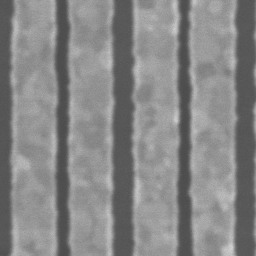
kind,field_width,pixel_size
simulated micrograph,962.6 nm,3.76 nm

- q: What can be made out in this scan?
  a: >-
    lines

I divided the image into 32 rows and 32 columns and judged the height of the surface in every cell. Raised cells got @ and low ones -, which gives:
--@@@@@--@@@@@---@@@@@--@@@@@---
--@@@@@--@@@@@---@@@@@--@@@@@---
--@@@@@--@@@@@---@@@@@--@@@@@---
--@@@@@--@@@@@---@@@@@--@@@@@---
--@@@@@--@@@@@---@@@@@--@@@@@---
-@@@@@@--@@@@@---@@@@@--@@@@@---
-@@@@@@--@@@@@---@@@@@--@@@@@---
-@@@@@@--@@@@@---@@@@@--@@@@@---
--@@@@@--@@@@@---@@@@@--@@@@@---
-@@@@@@--@@@@@---@@@@@--@@@@@---
-@@@@@@--@@@@@---@@@@@--@@@@@---
--@@@@@--@@@@@---@@@@@--@@@@@---
--@@@@@--@@@@@---@@@@@--@@@@@---
--@@@@@--@@@@@---@@@@@--@@@@@---
--@@@@@--@@@@@---@@@@@--@@@@@---
--@@@@@--@@@@@---@@@@@--@@@@@---
--@@@@@--@@@@@---@@@@@--@@@@@---
--@@@@@--@@@@@---@@@@@--@@@@@---
--@@@@@--@@@@@---@@@@@--@@@@@---
-@@@@@@--@@@@@---@@@@@--@@@@@---
-@@@@@@--@@@@@---@@@@@--@@@@@---
--@@@@@--@@@@@---@@@@@--@@@@@---
--@@@@@--@@@@@---@@@@@--@@@@@---
--@@@@@--@@@@@---@@@@@--@@@@@---
-@@@@@@--@@@@@---@@@@@--@@@@@---
-@@@@@@--@@@@@---@@@@@--@@@@@---
-@@@@@@--@@@@@---@@@@@--@@@@@---
--@@@@@--@@@@@---@@@@@--@@@@@---
--@@@@@--@@@@@---@@@@@--@@@@@---
--@@@@@--@@@@@---@@@@@--@@@@@---
--@@@@@--@@@@@---@@@@@--@@@@@---
--@@@@@--@@@@@---@@@@@--@@@@@---